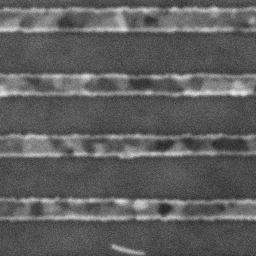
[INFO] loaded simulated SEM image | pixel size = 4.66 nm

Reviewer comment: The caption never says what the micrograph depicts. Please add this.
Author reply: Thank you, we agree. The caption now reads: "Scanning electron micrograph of lines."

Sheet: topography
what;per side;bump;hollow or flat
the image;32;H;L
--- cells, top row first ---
LLLLLLLLLLLLLLLLLLLLLLLLLLLLLLLL
HHHHHHHHHHHHHHHHHHHHHHHHHHHHHHHH
HHHHHHHHHHHHHHHHHHHHHHHHHHHHHHHH
HHHHHHHHHHHHHHHHHHHHHHHHHHHHHHHH
LLLLLLLLLLLLLLLLLLLLLLLLLLLLLLLL
LLLLLLLLLLLLLLLLLLLLLLLLLLLLLLLL
LLLLLLLLLLLLLLLLLLLLLLLLLLLLLLLL
LLLLLLLLLLLLLLLLLLLLLLLLLLLLLLLL
LLLLLLLLLLLLLLLLLLLLLLLLLLLLLLLL
HHHHHHHHLHHHHHHHLLLLHHHHHHHHHLHH
HHHHHHHHHHHHHHHHHHHHHHHHHHHHHHHH
HHHHHHHHHHHHHHHHHHHHHHHHHHHHHHHH
LLLLLLLLLLLLLLLLLLLLLLLLLLLLLLLL
LLLLLLLLLLLLLLLLLLLLLLLLLLLLLLLL
LLLLLLLLLLLLLLLLLLLLLLLLLLLLLLLL
LLLLLLLLLLLLLLLLLLLLLLLLLLLLLLLL
LLLLLLLLLLLLLLLLLLLLLLLLLLLLLLLL
HHHHHHHHHHHHHHHHHHHHHHHHHHHHHHHH
HHHHHHHHHHHHHHHHHHHHHHHHHHHHHHHH
LLLLLLLLLLLLLLLLLLLLLLLLLLLLLLLL
LLLLLLLLLLLLLLLLLLLLLLLLLLLLLLLL
LLLLLLLLLLLLLLLLLLLLLLLLLLLLLLLL
LLLLLLLLLLLLLLLLLLLLLLLLLLLLLLLL
LLLLLLLLLLLLLLLLLLLLLLLLLLLLLLLL
LLLLLLLLLLLLLLLLLLLLLLLLLLLLLLLL
HHHHHHHHHHHHHHHHHHHHHHHHHHHHHHHH
HHHHHHHHHHHHHHHHHHHHHHHHHHHHHHHH
LLLLLLLLLLLLLLLLLLLLLLLLLLLLLLLL
LLLLLLLLLLLLLLLLLLLLLLLLLLLLLLLL
LLLLLLLLLLLLLLLLLLLLLLLLLLLLLLLL
LLLLLLLLLLLLLLLLLLLLLLLLLLLLLLLL
LLLLLLLLLLLLLLLLLLLLLLLLLLLLLLLL